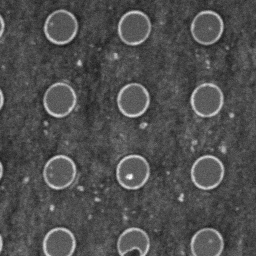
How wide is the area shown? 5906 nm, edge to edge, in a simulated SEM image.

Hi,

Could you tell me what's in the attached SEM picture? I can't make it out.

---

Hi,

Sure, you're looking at a regular array of raised bodies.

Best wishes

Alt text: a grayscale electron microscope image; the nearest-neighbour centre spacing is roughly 1670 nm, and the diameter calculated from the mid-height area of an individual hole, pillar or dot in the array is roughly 748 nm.